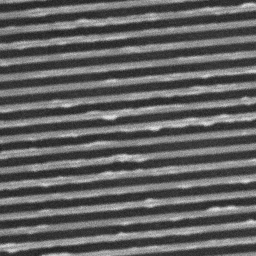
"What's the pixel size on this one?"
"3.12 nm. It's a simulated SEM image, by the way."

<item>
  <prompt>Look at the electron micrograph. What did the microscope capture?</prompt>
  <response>parallel lines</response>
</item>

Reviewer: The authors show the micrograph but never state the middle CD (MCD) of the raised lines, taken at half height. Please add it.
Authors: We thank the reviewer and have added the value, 18.2 nm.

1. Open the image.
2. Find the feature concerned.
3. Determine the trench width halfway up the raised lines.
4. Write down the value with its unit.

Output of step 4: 28.7 nanometers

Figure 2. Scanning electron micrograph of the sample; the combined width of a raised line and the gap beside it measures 15.4 pixels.